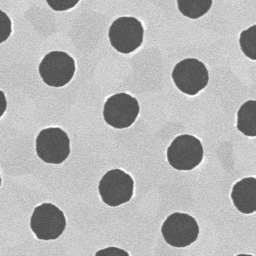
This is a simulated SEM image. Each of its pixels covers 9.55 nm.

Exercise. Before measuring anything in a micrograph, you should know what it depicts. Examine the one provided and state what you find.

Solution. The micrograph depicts a regular array of holes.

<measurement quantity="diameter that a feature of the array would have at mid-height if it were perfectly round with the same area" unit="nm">344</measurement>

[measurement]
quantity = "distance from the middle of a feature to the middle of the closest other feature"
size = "729 nm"